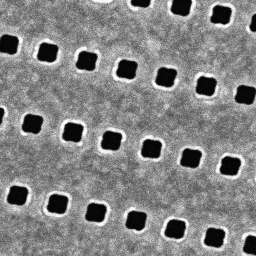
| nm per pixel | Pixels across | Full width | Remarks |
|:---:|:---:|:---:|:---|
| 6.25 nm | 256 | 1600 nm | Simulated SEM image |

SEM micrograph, a regular array of holes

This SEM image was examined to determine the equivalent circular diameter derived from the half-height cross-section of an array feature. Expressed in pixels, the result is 20.9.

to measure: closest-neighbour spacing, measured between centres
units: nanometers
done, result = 250